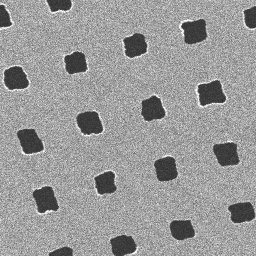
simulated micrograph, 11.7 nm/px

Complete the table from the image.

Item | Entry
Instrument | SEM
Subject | a regular array of holes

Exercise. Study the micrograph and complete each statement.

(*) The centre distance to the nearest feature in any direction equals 722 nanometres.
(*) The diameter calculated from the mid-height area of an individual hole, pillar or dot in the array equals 288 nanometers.